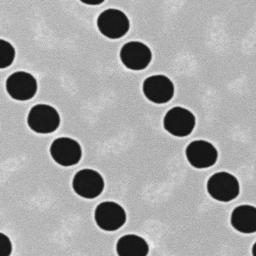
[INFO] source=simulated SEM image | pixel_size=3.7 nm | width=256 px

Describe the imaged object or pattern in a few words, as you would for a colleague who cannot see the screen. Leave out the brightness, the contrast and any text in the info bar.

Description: a regular array of holes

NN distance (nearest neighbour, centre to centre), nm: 144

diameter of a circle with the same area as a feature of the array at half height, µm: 0.113